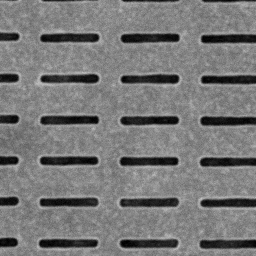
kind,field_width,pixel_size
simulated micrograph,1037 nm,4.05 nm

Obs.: a regular array of holes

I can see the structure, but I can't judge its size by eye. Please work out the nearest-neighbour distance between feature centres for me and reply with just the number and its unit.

166 nm